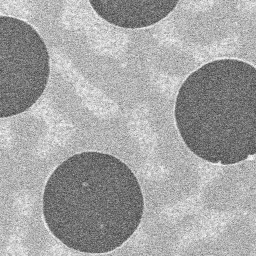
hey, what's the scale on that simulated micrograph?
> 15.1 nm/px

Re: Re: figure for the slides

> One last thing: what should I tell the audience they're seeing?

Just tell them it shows holes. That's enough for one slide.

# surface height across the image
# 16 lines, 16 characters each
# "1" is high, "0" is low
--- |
1111110000011111
0011111000111111
0001111111111111
0001111111111111
0001111111110000
0001111111100000
0011111111100000
1111111111100000
1111111111100000
1111111111110000
1111000011111111
1110000001111111
1110000001111111
1110000001111111
1110000011111111
1111000111111111